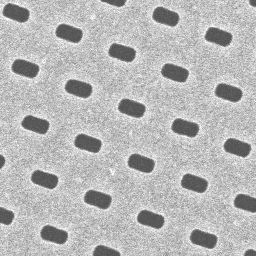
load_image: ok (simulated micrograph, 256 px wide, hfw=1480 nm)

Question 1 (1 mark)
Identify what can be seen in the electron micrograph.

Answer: a regular array of holes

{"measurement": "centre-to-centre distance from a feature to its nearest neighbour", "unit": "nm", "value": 324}